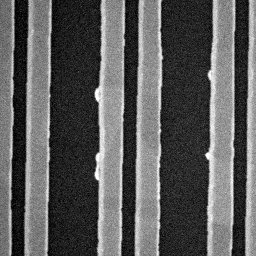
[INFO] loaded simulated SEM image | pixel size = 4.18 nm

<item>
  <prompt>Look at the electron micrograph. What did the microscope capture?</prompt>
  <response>lines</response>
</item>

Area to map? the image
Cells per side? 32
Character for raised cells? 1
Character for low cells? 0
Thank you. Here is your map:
11001100000001110011000000011001
11001100000001110011000000011001
11001100000001100011000000011001
11001100000001100011000000011001
11001100000001100011000000011001
11001100000001100011000000011001
11001100000001100011000000011001
11001100000001100011000000011001
11001100000001100111000000011001
10001100000001100111000000011001
11001100000001100111000000011001
11001100000011100111000000011001
10001100000001100111000000011001
11001100000001100111000000011001
11001100000001100111000000011001
11001100000001100111000000011001
10001100000001100111000000011001
10001100000001100111000000011001
10001100000001100111000000111001
10001100000001100111000000111001
10001100000001100111000000111001
10001100000011100111000000011001
10011100000001100111000000011001
10011100000001100111000000111001
10011100000001100111000000111001
10011100000001100111000000111001
10011100000001100111000000111001
10011100000001100111000000111001
10011100000001100111000000111001
10011100000001100111000000111001
10011100000001100111000000111001
10011100000001100111000000111001